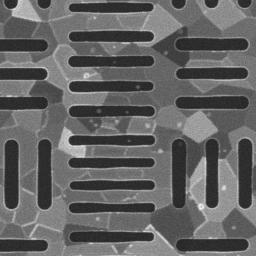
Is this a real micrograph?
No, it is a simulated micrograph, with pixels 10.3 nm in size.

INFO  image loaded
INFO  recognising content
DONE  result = groups of lines, slits or small figures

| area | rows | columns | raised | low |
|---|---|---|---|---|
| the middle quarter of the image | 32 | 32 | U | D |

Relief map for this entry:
UDDDDDDDDDDDDDDDDDDDDDUUUUUUUUUU
UUUUUUUUUUUUUUUUUUUUUUUUUUUUDDDD
UUUUUUUUUUUUUUUUUUUUUUUUUUUUDDDD
UUUUUUUUUUUUUUUUUUUUUUUUUUUUDDDD
UDDDDDDDDDDDDDDDDDDDDDUUUUUUUUUU
UDDDDDDDDDDDDDDDDDDDDDDUUUUUUUUU
UDDDDDDDDDDDDDDDDDDDDDUUUUUUUUUU
UUUUUUUUUUUUUUUUUUUUUUUUUUUUUUUU
UUUUUUUUUUUUUUUUUUUUUUUUUUUUDDDD
UUUUUUUUUUUUUUUUUUUUUUUUUUUUDDDD
UUDDDDDDDDDDDDDDDDDDDDUUUUUUDDDD
UDDDDDDDDDDDDDDDDDDDDDDUUUUUUUUU
UDDDDDDDDDDDDDDDDDDDDDDUUUUUUUUU
UUUDDUUUUUUUUUUUUUUUUUUUUUUUUUUU
UUUUUUUUUUUUUUUUUUUUUUUUUUUUUUUU
UUUUUUUUUUUUUUUUUUUUUUUUUUUUUUUU
UUUUUUUUUUUUUUUUUUUUUUUUUUUUUUUU
UUUUUUUUUUUUUUUDDDUUUUUUUUUUUUUU
UDDDDDDDDDDDDDDDDDDDDDDUUUUUUUUU
UDDDDDDDDDDDDDDDDDDDDDDUUUUDDDUU
UUDDDDDDDDDDDDDDDDDDDDUUUUUDDDDU
UUUUUUUUUUUUUUUUUUUUUUUUUUUDDDDU
UUUUUUUUUUUUUUUUUUUUUUUUUUUDDDDU
UUDDDDDDDDDDDDDDDDDDDDUUUUUDDDDU
UDDDDDDDDDDDDDDDDDDDDDDUUUUDDDDU
UDDDDDDDDDDDDDDDDDDDDDUUUUUDDDDU
UUUUUUUUUUUUUUUUUUUUUUUUUUUDDDDU
UUUUUUUUUUUUUUUUUUUUUUUUUUUDDDDU
UUUUUUUUUUUUUUUUUUUUUUUUUUUDDDDU
UUDDDDDDDDDDDDDDDDDDDDDUUUUDDDDU
UDDDDDDDDDDDDDDDDDDDDDDUUUUDDDDU
UUDDDDDDDDDDDDDDDDDDDDUUUUUDDDDU